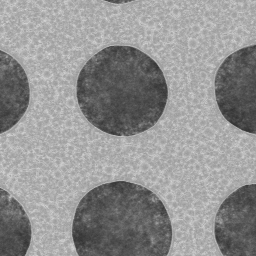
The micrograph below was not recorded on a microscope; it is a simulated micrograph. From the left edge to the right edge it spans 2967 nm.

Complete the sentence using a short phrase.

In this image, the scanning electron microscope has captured holes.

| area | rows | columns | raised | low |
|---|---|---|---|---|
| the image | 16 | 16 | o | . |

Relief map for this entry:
oooooooooooooooo
oooooooooooooooo
oooooooooooooooo
.ooooo...ooooo..
..ooo.....oooo..
..ooo.....ooo...
..ooo.....oooo..
.ooooo....oooo..
oooooooooooooooo
oooooooooooooooo
oooooooooooooooo
ooooooo.oooooooo
.oooo.....oooo..
..ooo......ooo..
..ooo......oo...
..ooo......ooo..